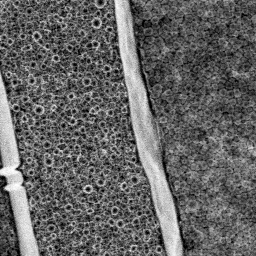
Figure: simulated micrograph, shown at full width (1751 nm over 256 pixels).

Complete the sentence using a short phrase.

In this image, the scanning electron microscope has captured one or a few lines or trenches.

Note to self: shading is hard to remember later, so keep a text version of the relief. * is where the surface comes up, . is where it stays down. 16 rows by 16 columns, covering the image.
********........
********........
********........
********........
********........
*********.......
*********.......
*********.......
*********.......
.********.......
.*********......
.*********......
.*********......
.*********......
..*********.....
..*********.....